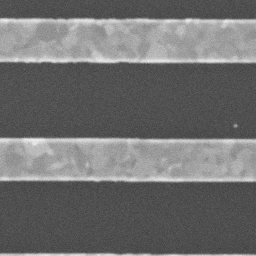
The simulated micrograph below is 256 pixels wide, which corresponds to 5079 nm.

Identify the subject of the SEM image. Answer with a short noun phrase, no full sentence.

lines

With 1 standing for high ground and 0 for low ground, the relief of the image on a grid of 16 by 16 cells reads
0000000000000000
1111111111111111
1111111111111111
1111111111111111
0000000000000000
0000000000000000
0000000000000000
0000000000000000
0000000000000000
1111111111111111
1111111111111111
0000000000000000
0000000000000000
0000000000000000
0000000000000000
0000000000000000